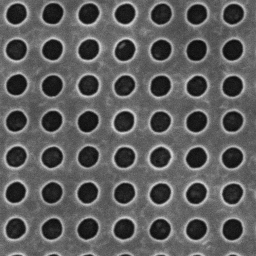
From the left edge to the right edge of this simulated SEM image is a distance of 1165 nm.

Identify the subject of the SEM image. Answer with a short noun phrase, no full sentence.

a regular array of holes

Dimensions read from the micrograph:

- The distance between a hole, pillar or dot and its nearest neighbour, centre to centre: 163 nanometers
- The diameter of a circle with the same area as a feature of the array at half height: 98.2 nm